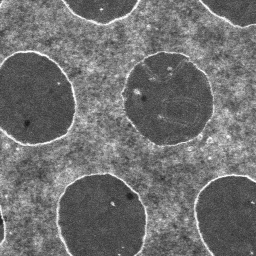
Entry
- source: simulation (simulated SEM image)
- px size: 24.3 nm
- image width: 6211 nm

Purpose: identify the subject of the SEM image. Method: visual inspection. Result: raised bodies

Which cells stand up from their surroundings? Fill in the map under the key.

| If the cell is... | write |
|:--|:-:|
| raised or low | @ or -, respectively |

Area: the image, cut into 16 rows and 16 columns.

----@@@@-----@@@
------@-------@@
----------------
-@@-------------
@@@@------------
@@@@@-----------
@@@@@-----------
@@@@@-----------
-@@@------------
----------------
----------------
----@@@@-----@@@
----@@@@@---@@@@
----@@@@@---@@@@
----@@@@@---@@@@
----@@@@@----@@@